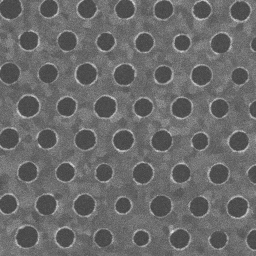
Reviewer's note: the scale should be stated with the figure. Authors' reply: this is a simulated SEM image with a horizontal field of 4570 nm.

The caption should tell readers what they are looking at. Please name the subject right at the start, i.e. a regular array of holes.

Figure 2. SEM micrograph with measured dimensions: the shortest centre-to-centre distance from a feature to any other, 670 nanometers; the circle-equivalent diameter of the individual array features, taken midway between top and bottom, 0.336 micrometres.